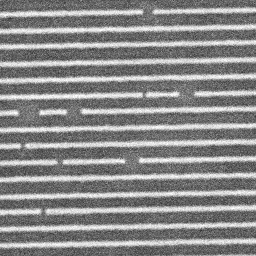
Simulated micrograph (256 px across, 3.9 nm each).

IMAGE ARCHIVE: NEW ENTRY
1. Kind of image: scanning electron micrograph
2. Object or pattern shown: parallel lines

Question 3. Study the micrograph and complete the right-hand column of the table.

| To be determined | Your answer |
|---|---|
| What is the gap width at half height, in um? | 0.0497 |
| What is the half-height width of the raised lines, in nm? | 13.2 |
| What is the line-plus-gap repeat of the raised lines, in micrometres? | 0.0643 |